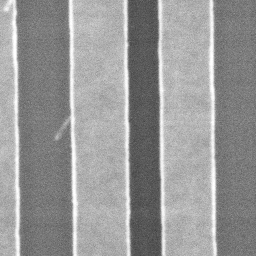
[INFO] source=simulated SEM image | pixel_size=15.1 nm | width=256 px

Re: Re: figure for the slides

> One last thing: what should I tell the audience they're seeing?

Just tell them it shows lines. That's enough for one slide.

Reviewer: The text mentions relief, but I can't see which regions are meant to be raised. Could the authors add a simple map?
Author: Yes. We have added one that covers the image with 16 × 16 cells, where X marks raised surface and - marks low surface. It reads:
X---XXXX--XXX---
X---XXXX--XXX---
X---XXXX--XXX---
X---XXXX--XXX---
X---XXXX--XXX---
X---XXXX--XXX---
X---XXXX--XXX---
X----XXX--XXX---
X----XXX--XXX---
X----XXX--XXX---
X----XXX--XXX---
X----XXX--XXX---
X----XXX--XXX---
X----XXX--XXX---
X----XXX--XXX---
X----XXX--XXX---